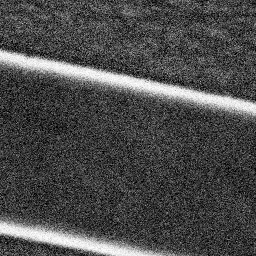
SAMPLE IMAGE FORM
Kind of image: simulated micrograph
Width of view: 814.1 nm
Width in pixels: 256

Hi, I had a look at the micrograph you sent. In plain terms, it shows one or a few lines or trenches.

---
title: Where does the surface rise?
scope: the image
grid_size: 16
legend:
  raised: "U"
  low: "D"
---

DDDDDDDDDDDDDDDD
DDDDDDDDDDDDDDDD
DDDDDDDDDDDDDDDD
DDDDDDDDDDDDDDDD
UUUUUDDDDDDDDDDD
UUUUUUUUUUDDDDDD
UUUUUUUUUUUUUUUD
UUUUUUUUUUUUUUUU
UUUUUUUUUUUUUUUU
UUUUUUUUUUUUUUUU
UUUUUUUUUUUUUUUU
UUUUUUUUUUUUUUUU
UUUUUUUUUUUUUUUU
UUUUUUUUUUUUUUUU
DUUUUUUUUUUUUUUU
DDDDDDUUUUUUUUUU